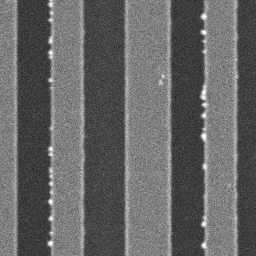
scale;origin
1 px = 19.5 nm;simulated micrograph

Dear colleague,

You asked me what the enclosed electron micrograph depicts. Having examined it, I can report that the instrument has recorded lines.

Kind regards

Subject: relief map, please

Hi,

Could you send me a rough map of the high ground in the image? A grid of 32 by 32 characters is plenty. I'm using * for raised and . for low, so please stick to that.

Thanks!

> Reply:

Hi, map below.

**....****......*****.....****..
**....****......*****.....***...
**....****......*****....****...
**....****......*****.....***...
**....****......*****.....****..
**....****......*****.....***...
**....****......*****.....****..
**....****......*****.....****..
**....****......*****.....****..
**....****......*****.....****..
**....****......*****.....****..
**....****......*****....*****..
**....****......*****....*****..
**....****......*****.....***...
**....****......*****....****...
**....****......*****.....***...
**....****......*****....****...
**....****......*****....*****..
**....****......*****.....***...
**....****......*****.....****..
**....****......*****.....***...
**....****......*****.....***...
**....****......*****.....****..
**....****......*****.....***...
**....****......*****.....****..
**....****......*****.....***...
**....****......*****.....****..
**....****......*****.....****..
**....****......*****.....****..
**....****......*****.....****..
**....****......*****....*****..
**....****......*****.....****..